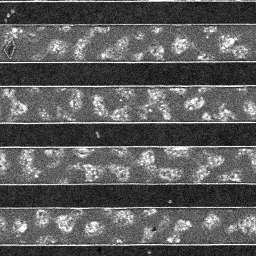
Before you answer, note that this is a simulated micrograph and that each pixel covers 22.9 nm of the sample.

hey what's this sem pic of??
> parallel lines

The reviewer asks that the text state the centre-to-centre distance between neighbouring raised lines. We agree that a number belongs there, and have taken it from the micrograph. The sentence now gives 1400 nm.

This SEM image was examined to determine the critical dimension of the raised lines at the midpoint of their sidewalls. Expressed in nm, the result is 550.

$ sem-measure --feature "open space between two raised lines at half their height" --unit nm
842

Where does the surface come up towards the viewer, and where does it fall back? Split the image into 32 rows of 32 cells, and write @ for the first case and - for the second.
@@@@@@@@@@@@@@@@@@@@@@@@@@@@@@@@
@@@@@@@@@@@@@@@@@@@@@@@@@@@@@@@@
@@@@@@@@@@@@@@@@@@@@@@@@@@@@@@@@
--------------------------------
--------------------------------
-@--------------------@-----@---
-@------------------------------
--------------------------------
@@@@@@@@@@@@@@@@@@@@@@@@@@@@@@@@
@@@@@@@@@@@@@@@@@@@@@@@@@@@@@@@@
@@@@@@@@@@@@@@@@@@@@@@@@@@@@@@@@
--------------------------------
--------------------------------
--@-----------------------------
--------------------------------
@@@@@@@@@@@@@@@@@@@@@@@@@@@@@@@@
@@@@@@@@@@@@@@@@@@@@@@@@@@@@@@@@
@@@@@@@@@@@@@@@@@@@@@@@@@@@@@@@@
-----@@-------------------------
--------------------------------
--------------------------------
--------------------------------
--------------------------------
@@@@@@@@@@@@@@@@@@@@@@@@@@@@@@@@
@@@@@@@@@@@@@@@@@@@@@@@@@@@@@@@@
@@@@@@@@@@@@@@@@@@@@@@@@@@@@@@@@
--------------------------------
--------------------------------
--------------------------------
--------------------------------
--------------------------------
@@@@@@@@@@@@@@@@@@@@@@@@@@@@@@@@